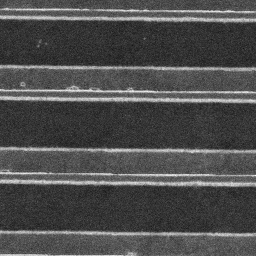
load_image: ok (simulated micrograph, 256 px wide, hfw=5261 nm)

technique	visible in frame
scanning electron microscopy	lines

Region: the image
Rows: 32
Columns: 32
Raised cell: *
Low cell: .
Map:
********************************
********************************
................................
................................
................................
................................
................................
................................
................................
********************************
********************************
********************************
...............................*
................................
................................
................................
................................
................................
................................
********************************
********************************
********************************
********************************
................................
................................
................................
................................
................................
................................
****************************....
********************************
********************************